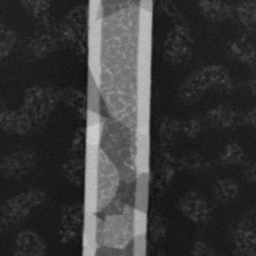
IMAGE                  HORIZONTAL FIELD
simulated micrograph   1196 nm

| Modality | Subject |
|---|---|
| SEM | one or a few lines or trenches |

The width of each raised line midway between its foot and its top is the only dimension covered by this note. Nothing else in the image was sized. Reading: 238 nm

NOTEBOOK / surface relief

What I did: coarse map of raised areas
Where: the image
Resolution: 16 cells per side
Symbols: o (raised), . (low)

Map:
......ooo.......
......ooo.......
......ooo.......
......ooo.......
......ooo.......
......ooo.......
......ooo.......
......ooo.......
......ooo.......
......ooo.......
......ooo.......
......ooo.......
......ooo.......
......ooo.......
......ooo.......
......ooo.......